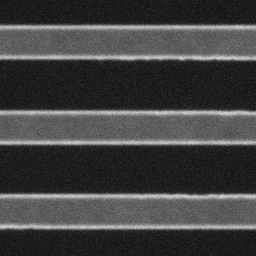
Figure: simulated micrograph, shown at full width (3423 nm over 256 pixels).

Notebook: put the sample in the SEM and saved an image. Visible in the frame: lines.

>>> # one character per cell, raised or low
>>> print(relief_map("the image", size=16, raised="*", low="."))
................
................
****************
****************
................
................
................
****************
****************
................
................
................
****************
****************
................
................